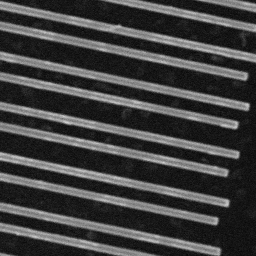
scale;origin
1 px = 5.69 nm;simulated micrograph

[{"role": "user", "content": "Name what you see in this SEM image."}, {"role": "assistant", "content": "parallel lines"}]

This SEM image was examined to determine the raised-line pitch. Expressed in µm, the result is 0.14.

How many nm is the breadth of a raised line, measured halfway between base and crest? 43.9